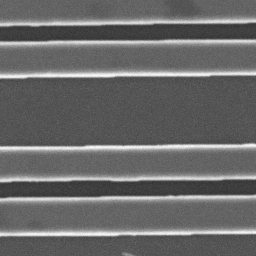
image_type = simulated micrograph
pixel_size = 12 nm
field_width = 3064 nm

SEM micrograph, lines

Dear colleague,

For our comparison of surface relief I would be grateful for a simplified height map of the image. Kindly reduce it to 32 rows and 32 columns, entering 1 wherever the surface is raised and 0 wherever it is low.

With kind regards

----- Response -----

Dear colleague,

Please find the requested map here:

11111111111111111111111111111111
11111111111111111111111111111111
11111111111111111111111111111111
00000000000000000000000000000000
00000000000000000000000000000000
11111111111111111111111111111111
11111111111111111111111111111111
11111111111111111111111111111111
11111111111111111111111111111111
11111111111100000000000000000000
00000000000000000000000000000000
00000000000000000000000000000000
00000000000000000000000000000000
00000000000000000000000000000000
00000000000000000000000000000000
00000000000000000000000000000000
00000000000000000000000000000000
00000000000000000000000000000000
11111111111111111111111111111111
11111111111111111111111111111111
11111111111111111111111111111111
11111111111111111111111111111111
11111111100000111100000000000000
00000000000000000000000000000000
00000000000000000000000000000000
11111111111111111111111111111111
11111111111111111111111111111111
11111111111111111111111111111111
11111111111111111111111111111111
00000000000000000000000000000000
00000000000000000000000000000000
00000000000000000000000000000000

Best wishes